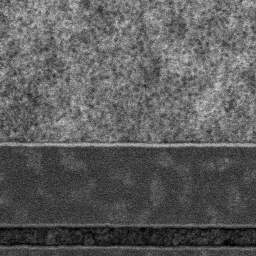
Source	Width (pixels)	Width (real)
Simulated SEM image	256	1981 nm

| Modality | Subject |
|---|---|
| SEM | one or a few lines or trenches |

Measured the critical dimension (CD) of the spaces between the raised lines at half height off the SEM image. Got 162 nanometers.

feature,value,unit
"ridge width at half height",632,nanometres